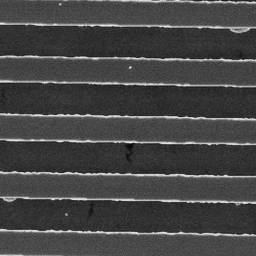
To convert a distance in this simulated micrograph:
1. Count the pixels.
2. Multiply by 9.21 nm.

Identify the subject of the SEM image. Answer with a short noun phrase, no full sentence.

lines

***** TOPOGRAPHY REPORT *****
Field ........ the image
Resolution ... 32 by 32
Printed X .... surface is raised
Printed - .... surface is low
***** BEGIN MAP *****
XXXXXXXXXXXXXXXXXXXXXXXXXXXXXXXX
XXXXXXXXXXXXXXXXXXXXXXXXXXXXXXXX
XXXXXXXXXXXXXXXXXXXXXXXXXXXXXXXX
--------------------------------
--------------------------------
--------------------------------
--------------------------------
XXXXXXXXXXXXXXXXXXXXXXXX-XXX----
XXXXXXXXXXXXXXXXXXXXXXXXXXXXXXXX
XXXXXXXXXXXXXXXXXXXXXXXXXXXXXXXX
----------------XXXXXXXXXXXXXXXX
--------------------------------
--------------------------------
--------------------------------
XXXXXXXXXXXXXXXX----------------
XXXXXXXXXXXXXXXXXXXXXXXXXXXXXXXX
XXXXXXXXXXXXXXXXXXXXXXXXXXXXXXXX
-XXXXXXXXXXXXXXXXXXXXXXXXXXXXXXX
--------------------------------
--------------------------------
--------------------------------
XXX-----------------------------
XXXXXXXXXXXXXXXXXXXXXXXXXXXXXXXX
XXXXXXXXXXXXXXXXXXXXXXXXXXXXXXXX
XXXXXXXXXXXXXXXXXXXXXXXXXXXXXXXX
--------------------------------
--------------------------------
--------------------------------
--------------------------------
XXXXXXXXXXXXXXXXXXXXXXXXXXXXXXXX
XXXXXXXXXXXXXXXXXXXXXXXXXXXXXXXX
XXXXXXXXXXXXXXXXXXXXXXXXXXXXXXXX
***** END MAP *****